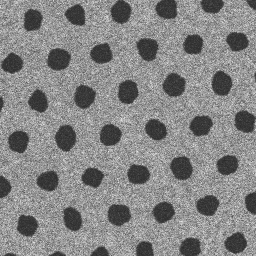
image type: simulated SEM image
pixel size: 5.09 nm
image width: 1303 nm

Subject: a regular array of holes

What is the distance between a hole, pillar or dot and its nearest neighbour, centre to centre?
227 nm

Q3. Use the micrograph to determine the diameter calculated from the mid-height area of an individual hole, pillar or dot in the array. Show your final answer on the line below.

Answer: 109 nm